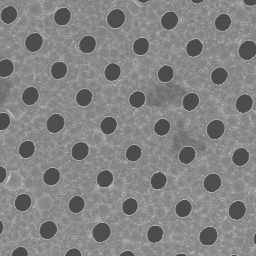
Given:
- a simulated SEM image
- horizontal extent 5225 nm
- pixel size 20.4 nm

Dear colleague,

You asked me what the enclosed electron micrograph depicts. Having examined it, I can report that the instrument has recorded a regular array of holes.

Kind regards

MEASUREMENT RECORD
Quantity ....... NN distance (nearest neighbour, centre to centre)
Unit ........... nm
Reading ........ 759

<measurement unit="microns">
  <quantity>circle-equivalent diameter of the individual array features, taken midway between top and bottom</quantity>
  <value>0.344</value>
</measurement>